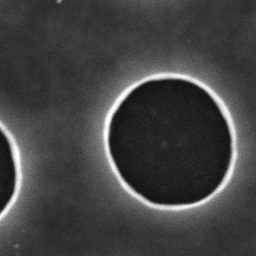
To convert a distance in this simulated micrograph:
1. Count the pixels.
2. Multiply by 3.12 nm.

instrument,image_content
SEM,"holes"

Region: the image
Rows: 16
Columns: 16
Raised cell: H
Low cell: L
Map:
HHHHHHHHHHHHHHHH
HHHHHHHHHHHHHHHH
HHHHHHHHHHHHHHHH
HHHHHHHHHHHHHHHH
HHHHHHHHHHHHHHHH
HHHHHHHHLLLLLHHH
HHHHHHHLLLLLLLHH
HHHHHHHLLLLLLLHH
HHHHHHHLLLLLLLLH
LHHHHHHLLLLLLLLH
LHHHHHHLLLLLLLHH
LHHHHHHHLLLLLLHH
LHHHHHHHHLLLLHHH
HHHHHHHHHHHHHHHH
HHHHHHHHHHHHHHHH
HHHHHHHHHHHHHHHH